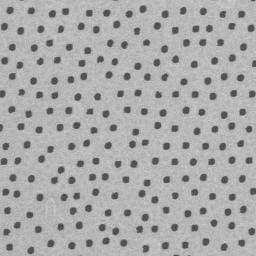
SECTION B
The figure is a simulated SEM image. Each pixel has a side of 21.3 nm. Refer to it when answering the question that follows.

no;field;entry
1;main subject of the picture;a regular array of holes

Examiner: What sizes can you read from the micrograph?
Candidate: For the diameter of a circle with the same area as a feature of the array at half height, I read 158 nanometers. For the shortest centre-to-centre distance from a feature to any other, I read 334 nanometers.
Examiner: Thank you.